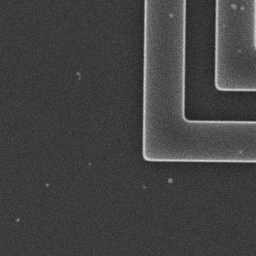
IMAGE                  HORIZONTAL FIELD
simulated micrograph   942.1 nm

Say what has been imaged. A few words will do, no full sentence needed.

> groups of lines, slits or small figures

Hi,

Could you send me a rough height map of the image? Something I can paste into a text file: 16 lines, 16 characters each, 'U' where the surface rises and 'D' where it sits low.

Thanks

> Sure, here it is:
DDDDDDDDDUUUDDUU
DDDDDDDDDUUUDDUU
DDDDDDDDDUUUDDUU
DDDDDDDDDUUDDUUU
DDDDDDDDDUUDDUUU
DDDDDDDDDUUDDDUU
DDDDDDDDDUUDDDDD
DDDDDDDDDUUUDDDD
DDDDDDDDDUUUUUUU
DDDDDDDDDUUUUUUU
DDDDDDDDDDDDDDDD
DDDDDDDDDDDDDDDD
DDDDDDDDDDDDDDDD
DDDDDDDDDDDDDDDD
DDDDDDDDDDDDDDDD
DDDDDDDDDDDDDDDD